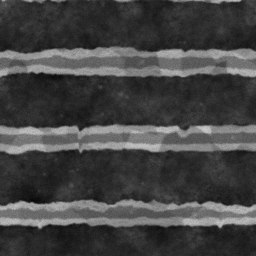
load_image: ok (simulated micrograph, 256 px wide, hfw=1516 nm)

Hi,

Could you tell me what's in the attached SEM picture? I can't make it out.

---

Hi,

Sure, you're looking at one or a few lines or trenches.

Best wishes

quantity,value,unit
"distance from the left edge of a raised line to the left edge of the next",0.447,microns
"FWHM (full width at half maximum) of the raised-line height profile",0.102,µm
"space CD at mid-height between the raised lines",342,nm